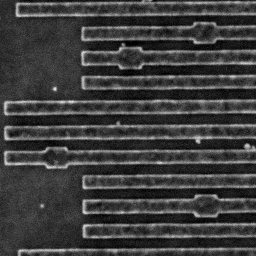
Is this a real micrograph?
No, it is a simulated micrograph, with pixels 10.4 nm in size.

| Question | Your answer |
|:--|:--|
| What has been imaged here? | wiring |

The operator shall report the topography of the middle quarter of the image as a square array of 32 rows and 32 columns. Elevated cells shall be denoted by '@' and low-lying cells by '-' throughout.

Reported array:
--------------@@@@@@------------
--------------------------------
--------------------------------
-----@@@@@@@@@@@@@@@@@@@@@@@@@@@
-----@@@@@@@@@@@@@@@@@@@@@@@@@@@
-----@@@@@@@@@@@@@@@@@@@@@@@@@@@
--------------------------------
--------------------------------
--------------------------------
@@@@@@@@@@@@@@@@@@@@@@@@@@@@@@@@
@@@@@@@@@@@@@@@@@@@@@@@@@@@@@@@@
@@@@@@@@@@@@@@@@@@@@@@@@@@@@@@@@
--------------------------------
--------------------------------
--------------------------------
------------@@@@-@@@@@@@@@@@@@@@
@@@@@@@@@@@@@@@@@@@@@@@@@@@@@@@@
@@@@@@@@@@@@@@@@@@@@@@@@@@@@@@@@
@@@@@@@@@@@@@@@@@@@@@@@@@@@@@@@@
--------------------------------
--------------------------------
@-------------------------------
@@@@@@@@@@@@@@@@@@@@@@@@@@@@@@@@
@@@@@@@@@@@@@@@@@@@@@@@@@@@@@@@@
@@@@@@@@@@@@@@@@@@@@@@@@@@@@@@@@
@-------------------------------
--------------------------------
--------------------------------
-----@@@@@@@@@@@@@@@@@@@@@@@@@@@
-----@@@@@@@@@@@@@@@@@@@@@@@@@@@
-----@@@@@@@@@@@@@@@@@@@@@@@@@@@
--------------------------------